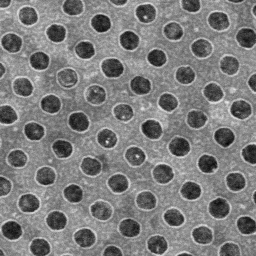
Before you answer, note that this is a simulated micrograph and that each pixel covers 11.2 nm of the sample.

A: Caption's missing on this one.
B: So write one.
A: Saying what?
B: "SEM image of a regular array of holes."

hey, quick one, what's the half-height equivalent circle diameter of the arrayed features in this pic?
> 228 nm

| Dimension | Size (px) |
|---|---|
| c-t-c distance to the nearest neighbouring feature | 31.6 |